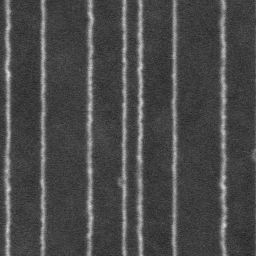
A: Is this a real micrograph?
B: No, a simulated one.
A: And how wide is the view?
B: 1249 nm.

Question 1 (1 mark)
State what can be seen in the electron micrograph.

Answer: lines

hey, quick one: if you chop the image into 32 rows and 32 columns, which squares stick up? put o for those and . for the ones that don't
o....oooooo.....oo....oooooo....
o....oooooo....ooo....oooooo....
o....oooooo....ooo....oooooo....
o....oooooo.....oo....oooooo....
o....oooooo.....o.....oooooo....
o....oooooo.....oo....oooooo....
o....oooooo....ooo....oooooo....
o....oooooo....ooo....oooooo....
o....oooooo....ooo....oooooo....
o....oooooo....ooo....oooooo....
o....oooooo.....oo....oooooo....
o....oooooo.....oo....oooooo....
o....oooooo.....oo....oooooo....
o....oooooo....ooo....oooooo....
o....oooooo....ooo....oooooo....
o....oooooo....ooo....oooooo....
o....oooooo....ooo....oooooo....
o....oooooo....ooo....oooooo....
o....oooooo....oo.....oooooo....
o....oooooo....oo.....oooooo....
o....oooooo....oo.....oooooo....
o....oooooo....oo.....oooooo....
o....oooooo....oo.....oooooo....
o....oooooo.....o.....oooooo....
o....oooooo....oo.....oooooo....
o....oooooo....oo.....oooooo....
o....oooooo....oo.....oooooo....
o....oooooo.....oo....oooooo....
o....oooooo....oo.....oooooo....
o....oooooo....ooo....oooooo....
o....oooooo....ooo....oooooo....
o....oooooo....ooo....oooooo....